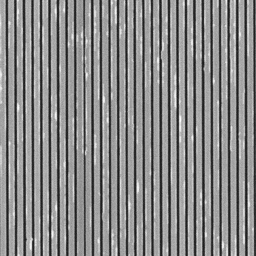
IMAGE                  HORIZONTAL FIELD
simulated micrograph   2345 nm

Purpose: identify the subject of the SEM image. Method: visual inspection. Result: parallel lines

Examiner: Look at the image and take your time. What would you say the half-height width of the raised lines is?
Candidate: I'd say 51.5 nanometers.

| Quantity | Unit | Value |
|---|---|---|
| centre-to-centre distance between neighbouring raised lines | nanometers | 78.1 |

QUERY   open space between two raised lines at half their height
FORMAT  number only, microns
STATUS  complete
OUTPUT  0.0252